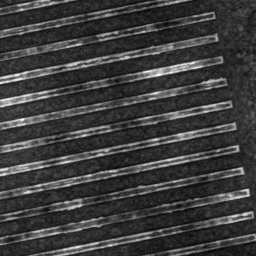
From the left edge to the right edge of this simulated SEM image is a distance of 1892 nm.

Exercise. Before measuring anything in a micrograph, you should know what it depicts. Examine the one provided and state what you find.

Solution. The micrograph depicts parallel lines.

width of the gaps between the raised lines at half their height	117	nm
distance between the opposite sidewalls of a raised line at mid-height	0.0489	micrometres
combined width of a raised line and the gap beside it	167	nm